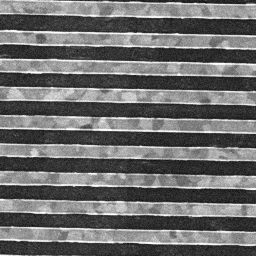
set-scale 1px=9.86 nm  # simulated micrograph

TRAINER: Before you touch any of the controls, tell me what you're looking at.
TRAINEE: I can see parallel lines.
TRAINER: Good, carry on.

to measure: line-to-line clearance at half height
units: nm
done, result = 153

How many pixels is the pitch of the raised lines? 28.3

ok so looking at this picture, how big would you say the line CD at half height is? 0.124 microns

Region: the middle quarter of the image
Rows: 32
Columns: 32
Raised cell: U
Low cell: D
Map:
UUUUUUUUUUUUUUUUUUUUUUUUUUUUUUUU
UUUUUUUUUUUUUUUUUUUUUUUUUUUUUUUU
DDDDDDDDDDDDDDDDDUUUUUUUUUUUUUUU
DDDDDDDDDDDDDDDDDDDDDDDDDDDDDDDD
DDDDDDDDDDDDDDDDDDDDDDDDDDDDDDDD
DDDDDDDDDDDDDDDDDDDDDDDDDDDDDDDD
UUUUUUUUUUUUUUUUDUUUUUDDDDDDDDDD
UUUUUUUUUUUUUUUUUUUUUUUUUUUUUUUU
UUUUUUUUUUUUUUUUUUUUUUUUUUUUUUUU
DDDDDDDDDDDDDDUUUUUUUUUUUUUUUUUU
DDDDDDDDDDDDDDDDDDDDDDDDDDDDDDDD
DDDDDDDDDDDDDDDDDDDDDDDDDDDDDDDD
DDDDDDDDDDDDDDDDDDDDDDDDDDDDDDDD
UUUUUUUUUDDDDDDDDDDDDDDDDDDDDDDD
UUUUUUUUUUUUUUUUUUUUUUUUUUUUUUUU
UUUUUUUUUUUUUUUUUUUUUUUUUUUUUUUU
DDDDDDDDDDDDDDUUUUUUUUUUUUUUUUUU
DDDDDDDDDDDDDDDDDDDDDDDDDDDDDDDD
DDDDDDDDDDDDDDDDDDDDDDDDDDDDDDDD
DDDDDDDDDDDDDDDDDDDDDDDDDDDDDDDD
UUUUUUUUUDDDDDDDDDDDDDDDDDDDDDDD
UUUUUUUUUUUUUUUUUUUUUUUUUUUUUUUU
UUUUUUUUUUUUUUUUUUUUUUUUUUUUUUUU
DDDDDDDDDDDDDDUUUUUUUUUUUUUUUUUU
DDDDDDDDDDDDDDDDDDDDDDDDDDDDDDDD
DDDDDDDDDDDDDDDDDDDDDDDDDDDDDDDD
DDDDDDDDDDDDDDDDDDDDDDDDDDDDDDDD
UUUUUUUUUDDUDUUDDDDDDDDDDDDDDDDD
UUUUUUUUUUUUUUUUUUUUUUUUUUUUUUUU
UUUUUUUUUUUUUUUUUUUUUUUUUUUUUUUU
DDDDDDDDDDDDDUUUUUUUUUUUUUUUUUUU
DDDDDDDDDDDDDDDDDDDDDDDDDDDDDDDD